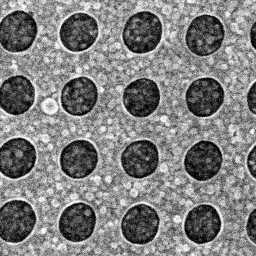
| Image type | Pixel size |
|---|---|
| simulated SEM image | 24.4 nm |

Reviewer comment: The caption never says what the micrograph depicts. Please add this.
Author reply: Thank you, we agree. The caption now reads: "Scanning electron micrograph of a regular array of holes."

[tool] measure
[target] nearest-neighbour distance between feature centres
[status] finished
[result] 1520 nm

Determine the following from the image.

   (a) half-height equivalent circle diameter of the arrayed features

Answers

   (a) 966 nm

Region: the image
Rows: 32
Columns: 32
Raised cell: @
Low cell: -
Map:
@@@@@@@@@@@@@@@@@@@@@@@@@@@@@@@@
@---@@@@@@@@@@@@@--@@@@@@@@@@@@@
----@@@@----@@@@----@@@@---@@@@@
-----@@@----@@@-----@@@-----@@@-
-----@@-----@@@-----@@@-----@@@-
----@@@@----@@@@----@@@-----@@@-
@--@@@@@@@@@@@@@---@@@@@---@@@@@
@@@@@@@@@@@@@@@@@@@@@@@@@@@@@@@@
@@@@@@@@@@@@@@@@@@@@@@@@@@@@@@@@
@@-@@@@@@@@@@@@@@@@@@@@@@@@@@@@@
----@@@@----@@@@----@@@@----@@@@
----@@@@----@@@-----@@@-----@@@-
----@@@-----@@@-----@@@-----@@@-
----@@@@----@@@@----@@@-----@@@-
@@@@@@@@@--@@@@@@--@@@@@@-@@@@@@
@@@@@@@@@@@@@@@@@@@@@@@@@@@@@@@@
@@@@@@@@@@@@@@@@@@@@@@@@@@@@@@@@
@---@@@@@--@@@@@@--@@@@@@@@@@@@@
----@@@@----@@@@----@@@@---@@@@@
-----@@-----@@@-----@@@-----@@@-
----@@@-----@@@-----@@@-----@@@-
----@@@@----@@@@---@@@@----@@@@-
@@@@@@@@@@@@@@@@@@@@@@@@--@@@@@@
@@@@@@@@@@@@@@@@@@@@@@@@@@@@@@@@
@@@@@@@@@@@@@@@@@@@@@@@@@@@@@@@@
----@@@@@--@@@@@@-@@@@@@@-@@@@@@
----@@@@----@@@@----@@@@---@@@@-
-----@@-----@@@-----@@@-----@@@-
----@@@-----@@@-----@@@-----@@@-
----@@@@---@@@@-----@@@----@@@@-
@@@@@@@@@@@@@@@@@-@@@@@@@-@@@@@@
@@@@@@@@@@@@@@@@@@@@@@@@@@@@@@@@